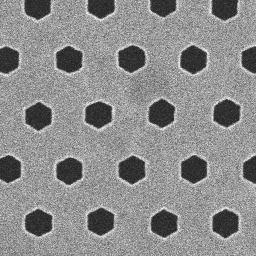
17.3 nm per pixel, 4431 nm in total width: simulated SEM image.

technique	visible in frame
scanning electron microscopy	a regular array of holes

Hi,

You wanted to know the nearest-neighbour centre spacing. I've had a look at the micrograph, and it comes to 1060 nanometres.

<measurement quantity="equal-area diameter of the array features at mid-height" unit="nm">474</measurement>